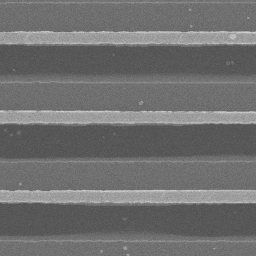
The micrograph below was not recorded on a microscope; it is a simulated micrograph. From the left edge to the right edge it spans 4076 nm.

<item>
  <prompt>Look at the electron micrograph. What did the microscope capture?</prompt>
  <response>lines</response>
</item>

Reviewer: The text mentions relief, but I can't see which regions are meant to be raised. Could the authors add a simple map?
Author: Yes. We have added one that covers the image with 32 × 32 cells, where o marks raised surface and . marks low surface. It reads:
oooooooooooooooooooooooooooooooo
oooooooooooooooooooooooooooooooo
oooooooooooooooooooooooooooooooo
oooooooooooooooooooooooooooooooo
oooooooooooooooooooooooooooooooo
.o.oo.ooooooo.ooooooooooooooo.oo
................................
................................
................................
................................
oooooooooooooooooooooooooooooooo
oooooooooooooooooooooooooooooooo
oooooooooooooooooooooooooooooooo
oooooooooooooooooooooooooooooooo
oooooooooooooooooooooooooooooooo
................................
................................
................................
................................
................................
oooooooooooooooooooooooooooooooo
oooooooooooooooooooooooooooooooo
oooooooooooooooooooooooooooooooo
oooooooooooooooooooooooooooooooo
oooooooooooooooooooooooooooooooo
................................
................................
................................
................................
................................
oooooooooooooooooooooooooooooooo
oooooooooooooooooooooooooooooooo